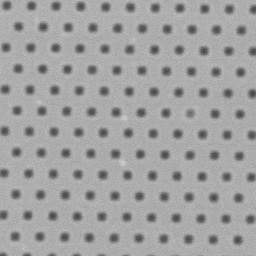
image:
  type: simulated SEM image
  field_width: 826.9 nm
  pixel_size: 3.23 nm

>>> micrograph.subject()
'a regular array of holes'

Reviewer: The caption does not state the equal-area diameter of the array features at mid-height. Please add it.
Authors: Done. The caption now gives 0.0322 µm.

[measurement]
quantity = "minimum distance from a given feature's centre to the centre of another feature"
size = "0.0773 micrometres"